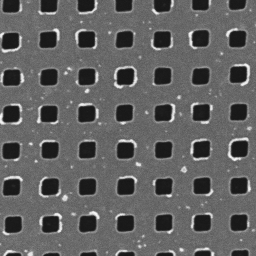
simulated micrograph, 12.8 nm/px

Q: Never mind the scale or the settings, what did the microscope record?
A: a regular array of holes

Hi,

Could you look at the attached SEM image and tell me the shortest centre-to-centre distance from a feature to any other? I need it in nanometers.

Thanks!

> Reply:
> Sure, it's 466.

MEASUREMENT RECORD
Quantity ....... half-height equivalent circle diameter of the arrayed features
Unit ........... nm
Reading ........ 234